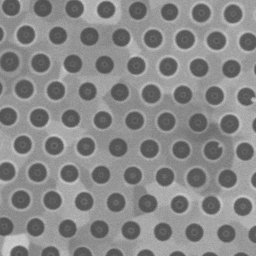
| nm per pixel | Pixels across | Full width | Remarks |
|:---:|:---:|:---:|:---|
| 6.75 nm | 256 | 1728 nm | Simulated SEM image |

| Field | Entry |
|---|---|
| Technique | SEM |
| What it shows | an array of small figures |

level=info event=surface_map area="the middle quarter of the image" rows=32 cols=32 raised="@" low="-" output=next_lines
-----@@@-----@@@-----@@------@@-
----@@@@----@@@@----@@@@----@@@-
@@@@@@@@@@-@@@@@@---@@@@----@@@@
@@@@@@@@@@@@@@@@@@@@@@@@@@@@@@@@
@@@@@@@@@@@@@@@@@@@@@@@@@@@@@@@@
@@@@----@@@@----@@@@----@@@@@--@
-@@@----@@@@----@@@-----@@@-----
@@@@----@@@@----@@@------@@-----
@@@@----@@@@----@@@-----@@@-----
@@@@@@@@@@@@@@@@@@@@----@@@@---@
@@@@@@@@@@@@@@@@@@@@@@@@@@@@@@@@
@--@@@@@@@@@@@@@@@@@@@@@@@@@@@@@
----@@@@----@@@@----@@@@---@@@@@
----@@@-----@@@-----@@@-----@@@-
----@@@-----@@@-----@@@-----@@@-
---@@@@@----@@@@----@@@-----@@@-
@@@@@@@@@-@@@@@@@-@@@@@@---@@@@@
@@@@@@@@@@@@@@@@@@@@@@@@@@@@@@@@
@@@@---@@@@@@-@@@@@@@@@@@@@@@@@@
@@@-----@@@@---@@@@@---@@@@@---@
@@@-----@@@-----@@@-----@@@----@
@@@-----@@@-----@@@-----@@@-----
@@@@---@@@@@---@@@@-----@@@-----
@@@@@@@@@@@@@@@@@@@@---@@@@@---@
@@@@@@@@@@@@@@@@@@@@@@@@@@@@@@@@
---@@@@@--@@@@@@@-@@@@@@@@@@@@@@
----@@@----@@@@----@@@@----@@@@-
----@@@-----@@@-----@@@-----@@@-
----@@@----@@@@-----@@@-----@@--
---@@@@@---@@@@----@@@@----@@@@-
@@@@@@@@@@@@@@@@@@@@@@@@--@@@@@-
@@@@@@@@@@@@@@@@@@@@@@@@@@@@@@@@